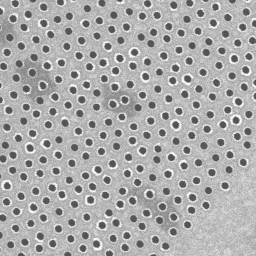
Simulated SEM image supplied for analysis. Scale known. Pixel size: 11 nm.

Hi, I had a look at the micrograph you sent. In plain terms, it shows a regular array of holes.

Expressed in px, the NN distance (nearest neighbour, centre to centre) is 14.1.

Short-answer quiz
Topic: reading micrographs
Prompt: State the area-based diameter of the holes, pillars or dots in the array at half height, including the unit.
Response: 75.7 nanometres